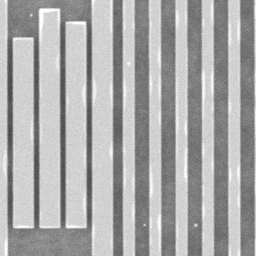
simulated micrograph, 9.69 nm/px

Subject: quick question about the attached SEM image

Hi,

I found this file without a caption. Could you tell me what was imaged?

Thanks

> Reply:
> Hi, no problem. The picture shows groups of lines, slits or small figures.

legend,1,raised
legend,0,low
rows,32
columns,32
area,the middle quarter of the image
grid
11111001111100011000011100001110
11111001111100011000011100001110
11111001111100011000011100001110
11111001111100011000001100001110
11111001111100011000001100001110
11111001111100011000001100001110
11111001111100011000001100001110
11111001111100011000011100001110
01111001111100011000011100001110
01111001111100011000011100001110
01111001111100011000011100001110
01111001111100011000011100001110
11111001111100011000011100001110
11111001111100011000011100001110
11111001111100011000011100001110
11111001111100011000011100001100
11111001111100011000011100001100
11111001111100011000011100001110
11111001111100011000011100001110
11111001111100011000011100001110
11111001111100011000011100001110
11111001111100011000011100001110
11111001111100011000011100001100
11111001111100011000011100001100
11111001111100011000011100001100
01111001111100011000011100001100
01111001111100011000001100001100
01111001111100011000001100001100
01111001111100011000001100001100
01111001111100011000001100001110
01111001111100011000001100001110
01111001111100011000001100001110